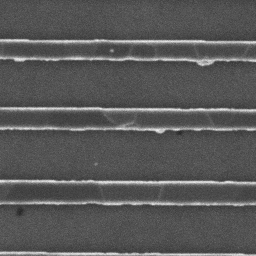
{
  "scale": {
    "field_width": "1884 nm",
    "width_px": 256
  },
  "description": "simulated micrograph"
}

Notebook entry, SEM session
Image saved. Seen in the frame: lines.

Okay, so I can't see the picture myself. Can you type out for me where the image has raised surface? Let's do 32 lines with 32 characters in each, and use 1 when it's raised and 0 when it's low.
00000000000000000000000000000000
00000000000000000000000000000000
00000000000000000000000000000000
00000000000000000000000000000000
00000000000000000000000000000000
11111111111111111111111111111111
11111111111111111111111111111111
00000000000000000000000011101001
00000000000000000000000000000000
00000000000000000000000000000000
00000000000000000000000000000000
00000000000000000000000000000000
00000000000000000000000000000000
00000000000000000000000000000000
11111111111111111111111111111111
11111111111111111111111111111111
00000000000000000000000000000000
00000000000000000000000000000000
00000000000000000000000000000000
00000000000000000000000000000000
00000000000000000000000000000000
00000000000000000000000000000000
00000000000000000000000000000000
11111111111111111111111111111111
11111111111111111111111111111111
00000000000001100001111111111111
00000000000000000000000000000000
00000000000000000000000000000000
00000000000000000000000000000000
00000000000000000000000000000000
00000000000000000000000000000000
00000000000000000000000000000000